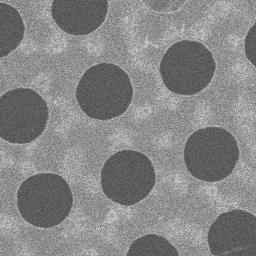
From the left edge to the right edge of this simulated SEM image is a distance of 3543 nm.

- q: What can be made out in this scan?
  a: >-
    holes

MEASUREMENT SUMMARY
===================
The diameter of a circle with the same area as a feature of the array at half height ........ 774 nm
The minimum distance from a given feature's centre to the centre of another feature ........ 1190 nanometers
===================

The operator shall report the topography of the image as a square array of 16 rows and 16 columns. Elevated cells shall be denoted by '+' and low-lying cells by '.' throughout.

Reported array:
.++....+++++++++
.+++..++++++++++
.++++++++++++++.
++++++++++...++.
+++++...++...+++
+++++...+++..+++
...++...++++++++
...+++++++++++++
..++++++++++...+
+++++++..++....+
++++++....++...+
+...++....++++++
+....++..+++++++
+...++++++++++..
+++++++++++++...
++++++++...++...